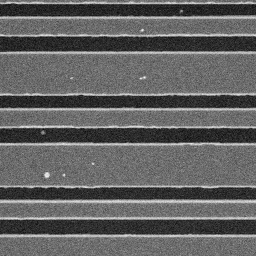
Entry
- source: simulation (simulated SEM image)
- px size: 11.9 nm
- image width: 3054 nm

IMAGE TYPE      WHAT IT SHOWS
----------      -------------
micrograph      lines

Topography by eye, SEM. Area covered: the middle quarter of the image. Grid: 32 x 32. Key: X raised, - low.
XXXXXXXXXXXXXXXXXXXXXXXXXXXXXXXX
XXXXXXXXXXXXXXXXXXXXXXXXXXXXXXXX
XXXXXXXXXXXXXXXXXXXXXXXXXXXXXXXX
XXXXXXXXXXXXXXXXXXXXXXXXXXXXXXXX
XXXXXXXXXXXXXXXXXXXXXXXXXXXXXXXX
XXXXXXXXXXXXXXXXXXXXXXXXXXXXXXXX
XXXXXXXXXXXXXXXXXXXXXXXXXXXXXXXX
XXXXXXXXXXXXXXXXXXXXXXXXXXXXXXXX
--------------------------------
--------------------------------
--------------------------------
XXXXXXXXXXXXXXXXXXXXXXXXXXXXXXXX
XXXXXXXXXXXXXXXXXXXXXXXXXXXXXXXX
XXXXXXXXXXXXXXXXXXXXXXXXXXXXXXXX
XXXXXXXXXXXXXXXXXXXXXXXXXXXXXXXX
XXXXXXXXXXXXXXXXXXXXXXXXXXXXXXXX
--------------------------------
--------------------------------
--------------------------------
--------------------------------
XXXXXXXXXXXXXXXXXXXXXXXXXXXXXXXX
XXXXXXXXXXXXXXXXXXXXXXXXXXXXXXXX
XXXXXXXXXXXXXXXXXXXXXXXXXXXXXXXX
XXXXXXXXXXXXXXXXXXXXXXXXXXXXXXXX
XXXXXXXXXXXXXXXXXXXXXXXXXXXXXXXX
XXXXXXXXXXXXXXXXXXXXXXXXXXXXXXXX
XXXXXXXXXXXXXXXXXXXXXXXXXXXXXXXX
XXXXXXXXXXXXXXXXXXXXXXXXXXXXXXXX
XXXXXXXXXXXXXXXXXXXXXXXXXXXXXXXX
XXXXXXXXXXXXXXXXXXXXXXXXXXXXXXXX
XXXXXXXXXXXXXXXXXXXXXXXXXXXXXXXX
--------------------------------